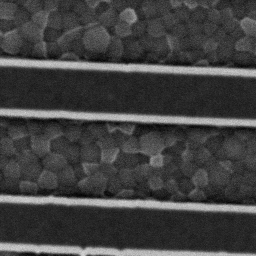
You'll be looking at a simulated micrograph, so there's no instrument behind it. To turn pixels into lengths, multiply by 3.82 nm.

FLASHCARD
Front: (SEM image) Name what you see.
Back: one or a few lines or trenches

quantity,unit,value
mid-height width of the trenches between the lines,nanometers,328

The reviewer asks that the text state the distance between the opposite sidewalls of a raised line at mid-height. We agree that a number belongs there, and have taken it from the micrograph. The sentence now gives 0.191 um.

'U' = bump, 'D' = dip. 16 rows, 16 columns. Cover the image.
DDDDDDDDDDDDDDDD
DDDDDDDDDDDDDDDD
DDDDDDDDDDDDDDDD
DDDDDDDDDDDDDDDD
UUUUUUUUUUUUUUDD
UUUUUUUUUUUUUUUU
UUUUUUUUUUUUUUUU
DDDDDDDDDDUUUUUU
DDDDDDDDDDDDDDDD
DDDDDDDDDDDDDDDD
DDDDDDDDDDDDDDDD
DDDDDDDDDDDDDDDD
UUDDDDDDDDDDDDDD
UUUUUUUUUUUUUUUU
UUUUUUUUUUUUUUUU
DUUUUUUUUUUUUUUU